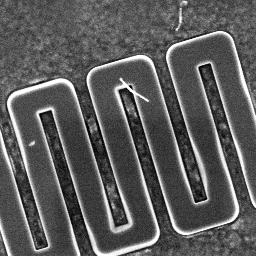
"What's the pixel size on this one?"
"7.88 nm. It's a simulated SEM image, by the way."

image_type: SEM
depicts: groups of lines, slits or small figures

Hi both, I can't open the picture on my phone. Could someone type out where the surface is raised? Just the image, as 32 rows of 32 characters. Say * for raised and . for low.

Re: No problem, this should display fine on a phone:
................................
................................
................................
................................
.........................****...
......................*******...
.....................*********..
...............****..*********..
............*******..****..***..
...........*********.****..***..
.....****..*********..***..****.
..*******..****..***..****.****.
.*********..***..***..****..***.
.*********..***..****..***..****
.****..***..****.****..****.****
..***..****.****..***..****..***
..****.****..***..****.****..***
..****..***..****.****..***..***
*..***..****.****..***..****..**
*..***..****..***..****..***..**
*..****.****..***..****..***..**
**.****..***..****..***..***..**
**..***..****..***..***..****..*
**..****.****..***..****..***..*
**..****..***..****.****..***..*
***.****..***..****..*********..
***..***..****..***..*********..
***..****..***..****.********...
****.****..***.*****..****......
****..***..*********............
.***..***...*******.............
.*********..***.................